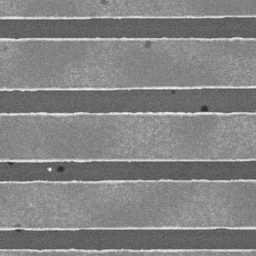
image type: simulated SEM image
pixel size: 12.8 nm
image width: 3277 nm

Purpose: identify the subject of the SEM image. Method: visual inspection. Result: lines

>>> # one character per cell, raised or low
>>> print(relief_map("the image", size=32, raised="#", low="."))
################################
################################
................................
................................
................................
################################
################################
################################
################################
################################
################################
................................
................................
................................
################################
################################
################################
################################
################################
################################
................................
................................
................................
################################
################################
################################
################################
################################
##########################..####
................................
................................
################################